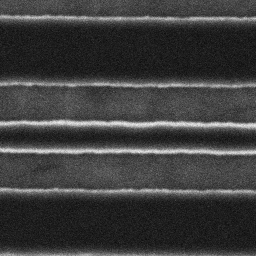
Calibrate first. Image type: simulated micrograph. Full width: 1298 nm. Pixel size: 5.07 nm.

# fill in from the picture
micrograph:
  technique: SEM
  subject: lines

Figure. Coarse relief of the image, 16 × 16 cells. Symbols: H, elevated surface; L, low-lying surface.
LLLLLLLLLLLLLLLL
HHHHHHHHHHHHHHHH
HHHHHHHHHHHHHHHH
HHHHHHHHHHHHHHHH
HHHHHHHHHHHHHHHH
LLLLLLLLLLLLLLLL
LLLLLLLLLLLLLLLL
LLLLLLLLLLLLLLLL
HHHHHHHHHHHHHHHH
LLHHHHHHHHHHHHHH
LLLLLLLLLLLLLLLL
LLLLLLLLLLLLLLLL
HHHHHHHHHHHHHHHH
HHHHHHHHHHHHHHHH
HHHHHHHHHHHHHHHH
HHHHHHHHHHHHHHHH